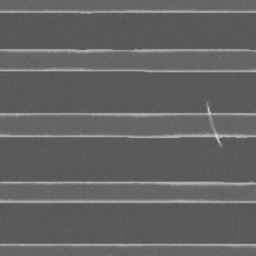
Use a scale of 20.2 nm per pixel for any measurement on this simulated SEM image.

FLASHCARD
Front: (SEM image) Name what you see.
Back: lines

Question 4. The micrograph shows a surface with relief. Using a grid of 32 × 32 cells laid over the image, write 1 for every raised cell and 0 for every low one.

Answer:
11111111111111111111111111111111
11111111111111111111111111111111
00000000000000000000000000000000
00000000000000000000000000000000
00000000000000000000000000000000
00000000000000000000000000000000
11111111111111111111111111111111
11111111111111111111111111111111
11111111111111111111111111111111
00000000000000000000000000000000
00000000000000000000000000000000
00000000000000000000000000000000
00000000000000000000000000000000
00000000000000000000000000000000
11111111111111111111111111111111
11111111111111111111111111111111
11111111111111111111111111111111
00000000000000000000000000000000
00000000000000000000000000000000
00000000000000000000000000000000
00000000000000000000000000000000
00000000000000000000000000000000
00000000000000000000000000000000
11111111111111111111111111111111
11111111111111111111111111111111
00000000000000000000000000000000
00000000000000000000000000000000
00000000000000000000000000000000
00000000000000000000000000000000
00000000000000000000000000000000
00000000000000000000000000000000
11111111111111111111111111111111